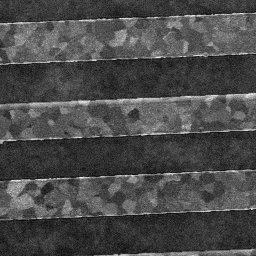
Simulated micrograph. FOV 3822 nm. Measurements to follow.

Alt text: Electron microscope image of lines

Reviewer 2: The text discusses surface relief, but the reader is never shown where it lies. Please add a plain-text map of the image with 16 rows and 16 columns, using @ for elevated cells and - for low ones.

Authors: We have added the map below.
----------------
@@@@@@@@@@@@@@@@
@@@@@@@@@@@@@@@@
@@@@@@@@@@@@----
----------------
----------------
---@@@@@@@@@@@@@
@@@@@@@@@@@@@@@@
@@@@@@@---------
----------------
----------------
@@@@@@@@@@@@@@@@
@@@@@@@@@@@@@@@@
@@@@@-----------
----------------
----------------